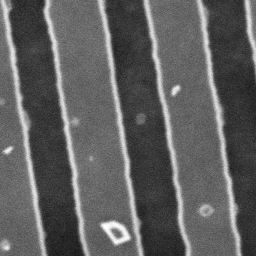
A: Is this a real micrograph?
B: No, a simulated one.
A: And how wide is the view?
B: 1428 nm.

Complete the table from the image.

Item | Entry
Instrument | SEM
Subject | lines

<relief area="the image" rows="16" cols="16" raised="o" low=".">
...ooo...oooo..o
o..oooo..oooo..o
o..oooo...ooo...
o..oooo...ooo...
o...ooo...ooo...
o...ooo...ooo...
o...ooo...oooo..
o...oooo..oooo..
oo..oooo...ooo..
oo..oooo...ooo..
oo..oooo...ooo..
oo...ooo...ooo..
oo...ooo...oooo.
oo...ooo...oooo.
ooo..oooo..oooo.
ooo..oooo...ooo.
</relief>